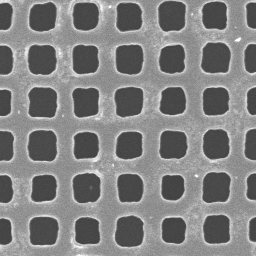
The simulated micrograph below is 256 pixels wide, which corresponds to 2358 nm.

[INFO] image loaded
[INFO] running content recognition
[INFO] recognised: a regular array of holes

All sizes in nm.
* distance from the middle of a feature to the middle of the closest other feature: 391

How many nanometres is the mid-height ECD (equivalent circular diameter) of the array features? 269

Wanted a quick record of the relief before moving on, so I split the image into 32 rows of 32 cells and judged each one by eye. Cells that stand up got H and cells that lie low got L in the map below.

LHHHHLLHHHLLHHHLLHHHLLLHHHLLHHHL
LLHHLLLHHLLLHHHLLLHHLLLHHLLLHHHL
LHHHLLLHHLLLHHHLLLHHLLLHHLLLHHHL
LHHHLLLHHHLLHHHLLHHHLLLHHHLLHHHH
HHHHHHHHHHHHHHHHHHHHHHHHHHHHHHHH
HHHHHHHHHHHHHHHHHHHHHHHHHHLLHHHH
LHHHLLLHHLLLHHHLLLHHLLLHHLLLLHHL
LLHLLLLHHLLLHHHLLLHHLLLHHLLLLHHL
LHHHLLLHHLLLHHHLLLHHLLLHHLLLLHHL
HHHHHHHHHHHHHHHHHHHHHHHHHHHHHHHH
HHHHHHHHHHHHHHHHHHHHHHHHHHHHHHHH
LHHHLLLHHLLLHHLLLLHHLLLHHLLLHHHL
LHHHLLLHHLLLHHLLLLHHLLLHHLLLLHHL
LHHHLLLHHLLLHHHLLLHHLLLHHLLLLHHL
HHHHLLLHHHLLHHHLHHHHHHHHHHHHHHHH
HHHHHHHHHHHHHHHHHHHHHHHHHHHHHHHH
LHHHLLLHHHHHHHHHLHHHHLLHHHLLHHHL
LLHHLLLHHLLLHHHLLLHHLLLHHLLLLHHL
LLHHLLLHHLLLHHHLLLHHLLLHHLLLLHHL
LLHHLLLHHLLLHHHLLHHHLLLHHHLLHHHL
HHHHHHHHHHHHHHHHHHHHHHHHHHHHHHHH
HHHHHHHHHHHHHHHHHHHHHHHHHHHLHHHH
LHHHLLLHHLLLHHHLLLHHLLLHHLLLLHHL
LHHHLLLHHLLLLHHLLLHHLLLHHLLLLHHL
LLHHLLLHHLLLHHHLLLHHLLLHHLLLLHHL
HHHHHHHHHHHHHHHHHHHHHHHHHHHHHHHH
HHHHHHHHHHHHHHHHHHHHHHHHHHHHHHHH
LHHHLLLHHHLLHHHLLLHHHLLHHHLLLHHL
LHHHLLLHHLLLHHLLLLHHLLLHHLLLLHHL
LLHHLLLHHLLLLHLLLLHHLLLHHHLLLHHL
HHHHLLLHHHLLHHHLLHHHHHHHHHHHHHHH
HHHHHHHHHHHHHHHHHHHHHHHHHHHHHHHH